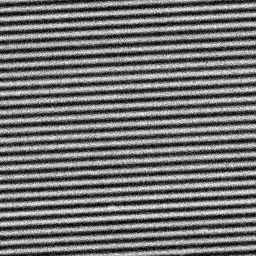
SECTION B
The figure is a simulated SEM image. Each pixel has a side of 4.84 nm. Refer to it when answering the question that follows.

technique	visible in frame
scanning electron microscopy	parallel lines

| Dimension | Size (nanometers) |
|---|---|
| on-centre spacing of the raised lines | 45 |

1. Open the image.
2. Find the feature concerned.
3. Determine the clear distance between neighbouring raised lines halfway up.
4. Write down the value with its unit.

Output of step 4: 0.0284 µm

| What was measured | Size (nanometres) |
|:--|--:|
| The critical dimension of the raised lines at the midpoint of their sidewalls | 16.9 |